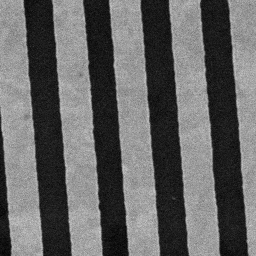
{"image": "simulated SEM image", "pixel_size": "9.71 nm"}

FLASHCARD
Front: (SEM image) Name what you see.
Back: lines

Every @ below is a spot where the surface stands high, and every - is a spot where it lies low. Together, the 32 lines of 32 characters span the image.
@@@----@@@----@@@@---@@@@----@@@
@@@----@@@----@@@@---@@@@----@@@
@@@----@@@@---@@@@---@@@@----@@@
@@@----@@@@---@@@@---@@@@----@@@
@@@----@@@@---@@@@---@@@@----@@@
@@@----@@@@---@@@@----@@@----@@@
@@@----@@@@---@@@@----@@@@---@@@
@@@----@@@@---@@@@----@@@@---@@@
@@@----@@@@---@@@@----@@@@---@@@
@@@@---@@@@---@@@@----@@@@---@@@
@@@@---@@@@----@@@----@@@@---@@@
@@@@---@@@@----@@@----@@@@---@@@
@@@@---@@@@----@@@----@@@@----@@
@@@@----@@@@---@@@@---@@@@----@@
@@@@----@@@@---@@@@---@@@@----@@
@@@@----@@@@---@@@@---@@@@----@@
@@@@----@@@@---@@@@---@@@@----@@
@@@@----@@@@---@@@@----@@@----@@
@@@@----@@@@---@@@@----@@@----@@
-@@@----@@@@---@@@@----@@@----@@
-@@@----@@@@---@@@@----@@@----@@
-@@@@---@@@@---@@@@----@@@@---@@
-@@@@---@@@@---@@@@----@@@@---@@
-@@@@---@@@@---@@@@----@@@@---@@
-@@@@---@@@@----@@@----@@@@---@@
-@@@@----@@@----@@@----@@@@----@
-@@@@----@@@----@@@@---@@@@----@
-@@@@----@@@----@@@@---@@@@----@
-@@@@----@@@@---@@@@---@@@@----@
-@@@@----@@@@---@@@@----@@@----@
-@@@@----@@@@---@@@@----@@@----@
-@@@@----@@@@---@@@@----@@@----@